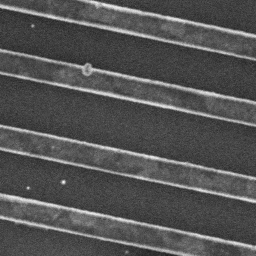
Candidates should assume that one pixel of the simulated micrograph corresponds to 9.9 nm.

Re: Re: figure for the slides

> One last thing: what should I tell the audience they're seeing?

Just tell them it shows lines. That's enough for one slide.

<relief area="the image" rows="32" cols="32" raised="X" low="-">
XXXXXXXXXXXXX-------------------
---XXXXXXXXXXXXXXX--------------
--------XXXXXXXXXXXXXXX---------
-------------XXXXXXXXXXXXXX-----
-----------------XXXXXXXXXXXXXXX
----------------------XXXXXXXXXX
X--------------------------XXXXX
XXXXXX--------------------------
XXXXXXXXXXXX--------------------
--XXXXXXXXXXXXXX----------------
-------XXXXXXXXXXXXXX-----------
------------XXXXXXXXXXXXXX------
----------------XXXXXXXXXXXXXXX-
---------------------XXXXXXXXXXX
--------------------------XXXXXX
-------------------------------X
XXXX----------------------------
XXXXXXXXX-----------------------
XXXXXXXXXXXXXX------------------
----XXXXXXXXXXXXXXX-------------
---------XXXXXXXXXXXXXXX--------
-------------XXXXXXXXXXXXXXX----
------------------XXXXXXXXXXXXXX
-----------------------XXXXXXXXX
X---------------------------XXXX
XXXXXX--------------------------
XXXXXXXXXXX---------------------
-XXXXXXXXXXXXXXX----------------
------XXXXXXXXXXXXXXX-----------
-----------XXXXXXXXXXXXXXX------
----------------XXXXXXXXXXXXXX--
---------------------XXXXXXXXXXX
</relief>